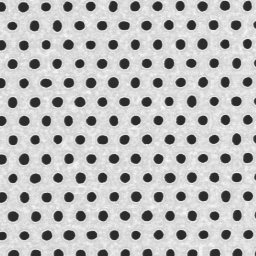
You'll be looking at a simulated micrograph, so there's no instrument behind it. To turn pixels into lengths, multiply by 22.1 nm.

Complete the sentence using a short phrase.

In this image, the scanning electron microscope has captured a regular array of holes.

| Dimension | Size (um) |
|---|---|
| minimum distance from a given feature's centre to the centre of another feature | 0.481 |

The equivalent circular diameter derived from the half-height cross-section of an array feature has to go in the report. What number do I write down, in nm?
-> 230